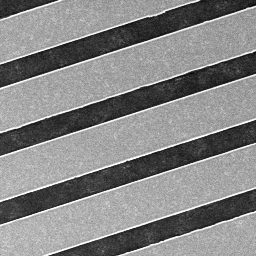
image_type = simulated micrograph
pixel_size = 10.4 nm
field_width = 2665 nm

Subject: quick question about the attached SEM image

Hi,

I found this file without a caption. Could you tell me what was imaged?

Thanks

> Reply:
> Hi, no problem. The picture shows one or a few lines or trenches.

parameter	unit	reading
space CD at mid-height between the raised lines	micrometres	0.24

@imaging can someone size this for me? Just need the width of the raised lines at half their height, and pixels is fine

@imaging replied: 42.5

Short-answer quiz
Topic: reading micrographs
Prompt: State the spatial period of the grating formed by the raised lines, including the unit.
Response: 680 nanometers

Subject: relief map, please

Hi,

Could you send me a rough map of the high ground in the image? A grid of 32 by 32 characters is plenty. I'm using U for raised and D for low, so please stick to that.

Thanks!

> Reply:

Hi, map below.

DDDDDDUUUUUUUUUUUUUUUUUDDDDDDDDD
DDDUUUUUUUUUUUUUUUUUDDDDDDDDDDUU
UUUUUUUUUUUUUUUUUDDDDDDDDDDUUUUU
UUUUUUUUUUUUUUDDDDDDDDDDUUUUUUUU
UUUUUUUUUUUDDDDDDDDDDUUUUUUUUUUU
UUUUUUUUDDDDDDDDDUUUUUUUUUUUUUUU
UUUUUDDDDDDDDDUUUUUUUUUUUUUUUUUD
UDDDDDDDDDDUUUUUUUUUUUUUUUUUDDDD
DDDDDDDDUUUUUUUUUUUUUUUUUDDDDDDD
DDDDDUUUUUUUUUUUUUUUUUDDDDDDDDDU
DDUUUUUUUUUUUUUUUUUDDDDDDDDDUUUU
UUUUUUUUUUUUUUUUDDDDDDDDDUUUUUUU
UUUUUUUUUUUUUDDDDDDDDDUUUUUUUUUU
UUUUUUUUUUDDDDDDDDDUUUUUUUUUUUUU
UUUUUUDDDDDDDDDDUUUUUUUUUUUUUUUU
UUUDDDDDDDDDDUUUUUUUUUUUUUUUUUDD
DDDDDDDDDDUUUUUUUUUUUUUUUUUDDDDD
DDDDDDDUUUUUUUUUUUUUUUUUDDDDDDDD
DDDUUUUUUUUUUUUUUUUUUDDDDDDDDDUU
UUUUUUUUUUUUUUUUUUDDDDDDDDDUUUUU
UUUUUUUUUUUUUUUDDDDDDDDDUUUUUUUU
UUUUUUUUUUUDDDDDDDDDDUUUUUUUUUUU
UUUUUUUUDDDDDDDDDDUUUUUUUUUUUUUU
UUUUUDDDDDDDDDDUUUUUUUUUUUUUUUUU
UUDDDDDDDDDDUUUUUUUUUUUUUUUUUDDD
DDDDDDDDUUUUUUUUUUUUUUUUUUDDDDDD
DDDDDUUUUUUUUUUUUUUUUUUDDDDDDDDD
DDUUUUUUUUUUUUUUUUUUDDDDDDDDDUUU
UUUUUUUUUUUUUUUUDDDDDDDDDDUUUUUU
UUUUUUUUUUUUUDDDDDDDDDDUUUUUUUUU
UUUUUUUUUUDDDDDDDDDDUUUUUUUUUUUU
UUUUUUUDDDDDDDDDDUUUUUUUUUUUUUUU